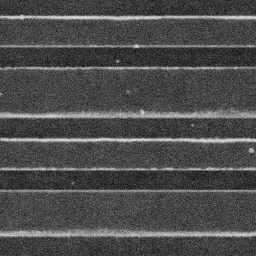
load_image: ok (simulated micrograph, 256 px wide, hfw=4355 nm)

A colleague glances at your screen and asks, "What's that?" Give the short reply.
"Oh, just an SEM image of lines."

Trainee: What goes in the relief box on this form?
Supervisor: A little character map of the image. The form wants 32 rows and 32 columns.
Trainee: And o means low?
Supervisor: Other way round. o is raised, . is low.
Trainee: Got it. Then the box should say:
................................
................................
oooooooooooooooooooooooooooooooo
oooooooooooooooooooooooooooooooo
oooooooooooooooooooooooooooooooo
oooooooooooooooooooooooooooooooo
................................
................................
oooooooooooooooooooooooooooooooo
oooooooooooooooooooooooooooooooo
oooooooooooooooooooooooooooooooo
oooooooooooooooooooooooooooooooo
oooooooooooooooooooooooooooooooo
oooooooooooooooooooooooooooooooo
..ooooo.........................
................................
................................
ooooo.......ooo.oooooooo........
oooooooooooooooooooooooooooooooo
oooooooooooooooooooooooooooooooo
oooooooooooooooooooooooooooooooo
................................
................................
................................
oooooooooooooooooooooooooooooooo
oooooooooooooooooooooooooooooooo
oooooooooooooooooooooooooooooooo
oooooooooooooooooooooooooooooooo
oooooooooooooooooooooooooooooooo
................................
................................
................................